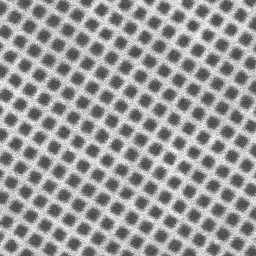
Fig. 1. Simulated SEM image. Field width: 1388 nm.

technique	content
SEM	a regular array of holes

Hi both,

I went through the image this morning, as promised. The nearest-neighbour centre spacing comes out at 92.6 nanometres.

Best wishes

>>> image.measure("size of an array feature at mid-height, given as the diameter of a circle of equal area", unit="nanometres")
77.6